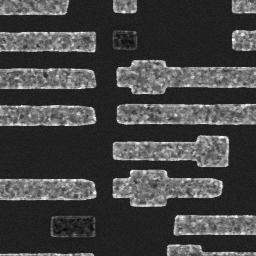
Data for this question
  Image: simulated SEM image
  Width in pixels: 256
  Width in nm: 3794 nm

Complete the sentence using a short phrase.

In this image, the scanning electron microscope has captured wiring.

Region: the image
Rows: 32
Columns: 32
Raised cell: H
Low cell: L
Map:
HHHHHHHHLLLLLLHHHLLLLLLLLLLLLHHH
HHHHHHHHLLLLLLLHHLLLLLLLLLLLLHHH
LLLLLLLLLLLLLLLLLLLLLLLLLLLLLLLL
LLLLLLLLLLLLLLLLLLLLLLLLLLLLLLLL
HHHHHHHHHHHHLLHHHLLLLLLLLLLLLHHH
HHHHHHHHHHHHLLHHHLLLLLLLLLLLLHHH
LLLLLLLLLLLLLLLLLLLLLLLLLLLLLLLL
LLLLLLLLLLLLLLLLLLLLLLLLLLLLLLLL
LLLLLLLLLLLLLLLHHHHHHHLHHLHHHHHL
HHHHHHHHHHHHLLLHHHHHHHHHHHHHHHHH
HHHHHHHHHHHHLLLHHHHHHHHHHHHHHHHH
LLLLLLLLLLLLLLLLLHHHLLLLLLLLLLLL
LLLLLLLLLLLLLLLLLLLLLLLLLLLLLLLL
HHHHHHHHHHHLLLLHHHHHHHHHHHHHHHHH
HHHHHHHHHHHHLLLHHHHHHHHHHHHHHHHH
HHHHHHHHHHHLLLLLLLLLLLLLLLLLLLLL
LLLLLLLLLLLLLLLLLLLLLLLLLLLLLLLL
LLLLLLLLLLLLLLLLLLLLLLLLLHHHLLLL
LLLLLLLLLLLLLLHHHHHHHHHHHHHHLLLL
LLLLLLLLLLLLLLHHHHHHHHHHHHHHLLLL
LLLLLLLLLLLLLLLLLLLLLLLLLHHHLLLL
LLLLLLLLLLLLLLLLLHHHLLLLLLLLLLLL
LLHHLLLLLLLLLLLHHHHHHHHHHHHLLLLL
HHHHHHHHHHHHLLHHHHHHHHHHHHHHLLLL
HHHHHHHHHHHHLLHHHHHHHHHHHHHLLLLL
LLLLLLLLLLLLLLLLLHHHHLLLLLLLLLLL
LLLLLLLLLLLLLLLLLLLLLLLLLLLLLLLL
LLLLLLHHHHHHLLLLLLLLLLHHHHHHHHHH
LLLLLLHHHHHHLLLLLLLLLLHHHHHHHHHH
LLLLLLLHHHHLLLLLLLLLLLLLLLLLLLLL
LLLLLLLLLLLLLLLLLLLLLLLLLLLLLLLL
LLLLLLLLLLLLLLLLLLLLLHHHHHLLLLLL